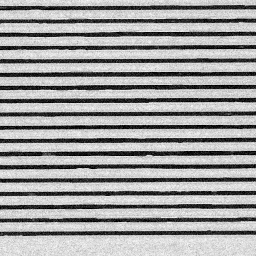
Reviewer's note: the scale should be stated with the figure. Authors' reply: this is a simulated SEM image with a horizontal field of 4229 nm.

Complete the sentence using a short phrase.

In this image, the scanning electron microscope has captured parallel lines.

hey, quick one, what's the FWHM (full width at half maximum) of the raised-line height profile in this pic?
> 138 nm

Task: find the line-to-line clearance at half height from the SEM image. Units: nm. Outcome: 76.4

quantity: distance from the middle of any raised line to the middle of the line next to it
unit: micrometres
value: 0.219